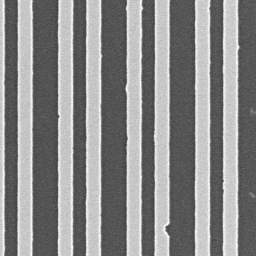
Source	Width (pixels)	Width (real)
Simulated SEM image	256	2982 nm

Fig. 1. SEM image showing parallel lines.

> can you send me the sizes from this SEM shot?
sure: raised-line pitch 399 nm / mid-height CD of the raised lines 14.2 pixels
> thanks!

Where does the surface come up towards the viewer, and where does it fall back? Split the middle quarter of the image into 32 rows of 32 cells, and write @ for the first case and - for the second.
@@----@@@-------@@@----@@@------
@@----@@@-------@@@----@@@------
@@----@@@-------@@@----@@@------
@@----@@@-------@@@----@@@------
@@----@@@-------@@@----@@@------
@@----@@@-------@@@----@@@------
@@----@@@-------@@@----@@@------
@@----@@@-------@@@----@@@------
@@----@@@-------@@@----@@@------
@@----@@@-------@@@----@@@------
@@----@@@-------@@@----@@@------
@@----@@@-------@@@----@@@------
@@----@@@-------@@@----@@@------
@@----@@@-------@@@----@@@------
@@----@@@-------@@@----@@@------
@@----@@@-------@@@----@@@------
@@----@@@-------@@@----@@@------
@@----@@@-------@@@----@@@------
@@----@@@-------@@@----@@@------
@@----@@@-------@@@----@@@------
@@----@@@-------@@@----@@@------
@@----@@@-------@@@----@@@------
@@----@@@-------@@@----@@@------
@@----@@@-------@@@----@@@------
@@----@@@-------@@@----@@@------
@@----@@@-------@@@----@@@------
@@----@@@-------@@@----@@@------
@@----@@@-------@@@----@@@------
@@----@@@-------@@@----@@@------
@@----@@@-------@@@----@@@------
@@----@@@-------@@@----@@@------
@@----@@@-------@@@----@@@------